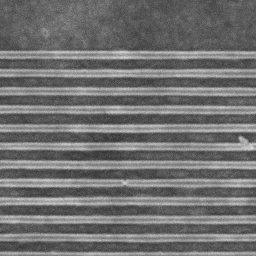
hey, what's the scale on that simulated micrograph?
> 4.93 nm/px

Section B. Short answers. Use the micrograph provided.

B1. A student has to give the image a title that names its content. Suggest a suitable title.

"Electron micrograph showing parallel lines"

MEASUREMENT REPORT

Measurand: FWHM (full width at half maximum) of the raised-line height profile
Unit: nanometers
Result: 28.9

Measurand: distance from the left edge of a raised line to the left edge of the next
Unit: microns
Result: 0.0901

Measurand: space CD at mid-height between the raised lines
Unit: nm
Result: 62.2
